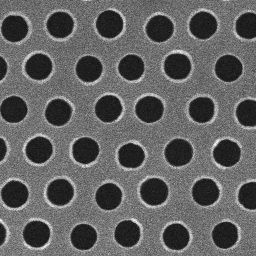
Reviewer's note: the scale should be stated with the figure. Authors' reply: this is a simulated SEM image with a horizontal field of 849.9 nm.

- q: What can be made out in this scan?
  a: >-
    a regular array of holes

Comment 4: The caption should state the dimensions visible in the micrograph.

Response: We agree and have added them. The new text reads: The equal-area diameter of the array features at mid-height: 88.6 nm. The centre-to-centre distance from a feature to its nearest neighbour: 147 nanometres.